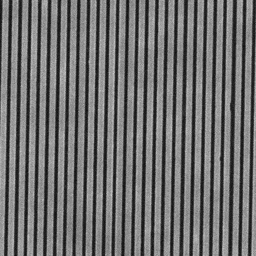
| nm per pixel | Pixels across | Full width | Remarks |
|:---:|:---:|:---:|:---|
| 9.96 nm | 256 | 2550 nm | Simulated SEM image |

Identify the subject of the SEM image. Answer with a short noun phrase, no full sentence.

parallel lines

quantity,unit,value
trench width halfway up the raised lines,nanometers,37.4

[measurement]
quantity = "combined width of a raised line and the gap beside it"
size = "97.1 nm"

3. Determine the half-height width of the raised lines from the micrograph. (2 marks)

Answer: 54.8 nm